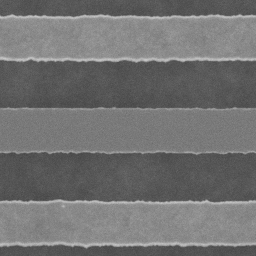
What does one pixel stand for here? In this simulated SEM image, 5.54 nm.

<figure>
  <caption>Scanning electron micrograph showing lines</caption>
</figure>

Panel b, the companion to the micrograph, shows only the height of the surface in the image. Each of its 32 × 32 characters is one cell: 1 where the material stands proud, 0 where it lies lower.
00000000000000000000000000000000
00000000000000000000000000000000
11111111111111111111111111111111
11111111111111111111111111111111
11111111111111111111111111111111
11111111111111111111111111111111
11111111111111111111111111111111
01111111111111101111111111111011
00000000000000000000000000000000
00000000000000000000000000000000
00000000000000000000000000000000
00000000000000000000000000000000
00000000000000000000000000000000
00110000000010000000000010000100
11111111111111111111111111111111
11111111111111111111111111111111
11111111111111111111111111111111
11111111111111111111111111111111
11111111111111111111111111111111
00000000000000000000000000000000
00000000000000000000000000000000
00000000000000000000000000000000
00000000000000000000000000000000
00000000000000000000000000000000
00000000000000000000000000000000
11111111111111111111111111111111
11111111111111111111111111111111
11111111111111111111111111111111
11111111111111111111111111111111
11111111111111111111111111111111
11111111111111111111111111111111
00000000000000000000000000000000